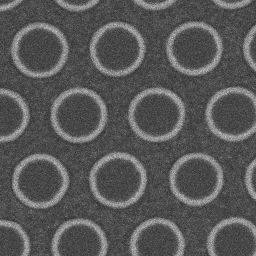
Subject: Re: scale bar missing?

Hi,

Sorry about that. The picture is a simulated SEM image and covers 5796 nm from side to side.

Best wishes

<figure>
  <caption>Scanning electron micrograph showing a regular array of raised bodies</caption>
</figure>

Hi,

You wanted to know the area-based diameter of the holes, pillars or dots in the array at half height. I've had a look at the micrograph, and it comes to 1140 nanometers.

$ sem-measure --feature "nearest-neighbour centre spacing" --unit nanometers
1720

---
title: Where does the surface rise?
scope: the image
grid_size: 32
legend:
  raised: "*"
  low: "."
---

**......***.......***.......**..
................................
................................
....**.......***.......***......
..******....*****.....*****....*
..******....******...*******...*
..******....******...*******...*
..******....*****....******....*
...****......****.....****......
................................
................................
*........**.......***.......***.
***....*****.....*****.....*****
***....******...*******...******
***....******...*******...******
***....******....******...******
**.....*****.....*****.....****.
.........**.....................
................................
..............**........**......
...****.....*****.....*****.....
..******....******....******...*
..******....******...*******...*
..******....******....*****....*
..******....*****.....*****.....
....**........**................
................................
................................
**......****.....*****.....*****
***....******....*****....******
***....******....******...******
***....******....******...******